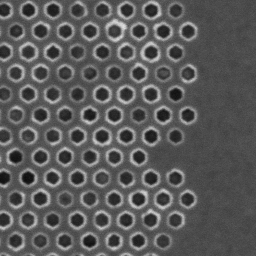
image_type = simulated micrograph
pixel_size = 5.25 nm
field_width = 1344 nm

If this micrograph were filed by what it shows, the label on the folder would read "a regular array of holes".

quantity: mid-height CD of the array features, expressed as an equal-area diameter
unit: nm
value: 71.8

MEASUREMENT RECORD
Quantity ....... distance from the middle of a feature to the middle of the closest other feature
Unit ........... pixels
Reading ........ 24.1